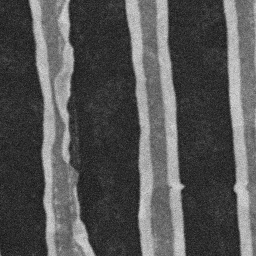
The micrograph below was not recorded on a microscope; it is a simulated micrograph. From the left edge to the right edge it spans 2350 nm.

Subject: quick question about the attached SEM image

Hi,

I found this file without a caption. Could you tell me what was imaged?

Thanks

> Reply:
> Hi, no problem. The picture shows one or a few lines or trenches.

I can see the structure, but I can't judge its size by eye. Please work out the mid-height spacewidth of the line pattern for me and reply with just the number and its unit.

622 nanometers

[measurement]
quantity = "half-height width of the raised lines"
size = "254 nm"